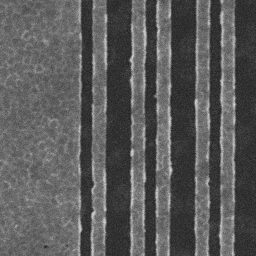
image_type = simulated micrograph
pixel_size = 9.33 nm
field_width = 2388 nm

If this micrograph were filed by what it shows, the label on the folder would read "parallel lines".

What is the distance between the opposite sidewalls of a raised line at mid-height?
120 nanometers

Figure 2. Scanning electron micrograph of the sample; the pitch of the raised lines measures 297 nanometres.